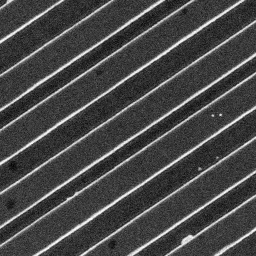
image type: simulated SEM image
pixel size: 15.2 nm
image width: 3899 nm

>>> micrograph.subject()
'lines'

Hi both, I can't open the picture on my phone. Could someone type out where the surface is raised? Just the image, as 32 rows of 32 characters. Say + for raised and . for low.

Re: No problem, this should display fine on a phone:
.++++++......+++++++...+++++++..
++++++......++++++....++++++....
++++......+++++++...+++++++.....
+++......++++++....++++++......+
+......+++++++...+++++++.....+++
......++++++....++++++......++++
....+++++++...+++++++.....++++++
...++++++....++++++......++++++.
.+++++++...+++++++.....+++++++..
++++++....++++++......++++++...+
+++++...+++++++.....+++++++...++
++++...++++++......++++++...++++
++...+++++++.....+++++++...+++++
+...+++++++.....++++++...+++++++
...++++++.....+++++++...++++++..
.+++++++.....++++++...+++++++...
++++++.....+++++++...++++++.....
+++++.....++++++....++++++.....+
+++.....+++++++...+++++++.....++
++.....++++++....++++++.....++++
.....+++++++...+++++++.....+++++
....++++++....++++++.....+++++++
..+++++++...+++++++.....+++++++.
.++++++....++++++......++++++...
++++++...+++++++.....+++++++....
++++....++++++......++++++....++
+++...+++++++.....+++++++....+++
++...++++++......++++++....+++++
...+++++++.....+++++++....++++++
..++++++......++++++....+++++++.
+++++++.....+++++++....++++++...
+++++......++++++....+++++++....